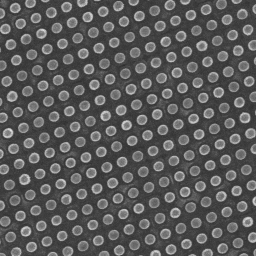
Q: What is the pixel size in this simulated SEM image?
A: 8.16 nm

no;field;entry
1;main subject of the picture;a regular array of raised bodies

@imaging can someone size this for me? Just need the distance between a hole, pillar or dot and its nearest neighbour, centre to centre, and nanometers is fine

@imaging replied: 132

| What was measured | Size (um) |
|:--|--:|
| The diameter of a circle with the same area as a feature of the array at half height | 0.0813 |